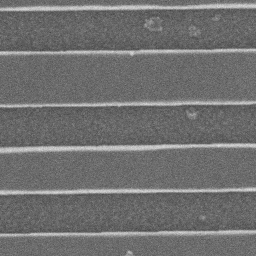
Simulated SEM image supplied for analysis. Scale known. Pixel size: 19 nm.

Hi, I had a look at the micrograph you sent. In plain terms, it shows lines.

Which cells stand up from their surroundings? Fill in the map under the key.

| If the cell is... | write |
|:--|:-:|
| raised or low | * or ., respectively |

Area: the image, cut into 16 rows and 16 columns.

*****...........
................
................
****************
****************
****************
***************.
................
................
****************
****************
****************
................
................
............****
****************